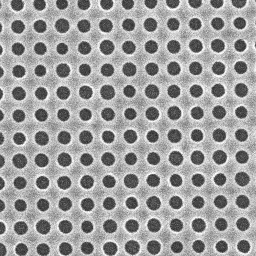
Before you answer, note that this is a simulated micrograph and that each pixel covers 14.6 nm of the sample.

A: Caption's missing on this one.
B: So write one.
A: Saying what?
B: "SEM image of a regular array of holes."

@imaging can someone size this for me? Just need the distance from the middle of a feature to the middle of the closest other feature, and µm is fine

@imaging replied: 0.321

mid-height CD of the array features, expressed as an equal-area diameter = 208 nanometers